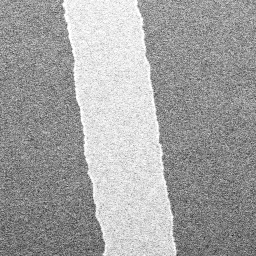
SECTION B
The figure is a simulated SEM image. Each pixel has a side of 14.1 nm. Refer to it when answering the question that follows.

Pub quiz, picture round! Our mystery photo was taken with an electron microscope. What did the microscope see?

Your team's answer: one or a few lines or trenches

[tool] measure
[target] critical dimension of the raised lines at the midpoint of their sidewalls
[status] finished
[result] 72.9 px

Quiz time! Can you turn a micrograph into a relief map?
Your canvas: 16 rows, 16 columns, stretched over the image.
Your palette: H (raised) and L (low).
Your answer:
LLLLHHHHHLLLLLLL
LLLLHHHHHLLLLLLL
LLLLHHHHHLLLLLLL
LLLLLHHHHLLLLLLL
LLLLLHHHHLLLLLLL
LLLLLHHHHLLLLLLL
LLLLLHHHHHLLLLLL
LLLLLHHHHHLLLLLL
LLLLLHHHHHLLLLLL
LLLLLHHHHHLLLLLL
LLLLLLHHHHLLLLLL
LLLLLLHHHHLLLLLL
LLLLLLHHHHHLLLLL
LLLLLLHHHHHLLLLL
LLLLLLHHHHHLLLLL
LLLLLLLHHHHLLLLL